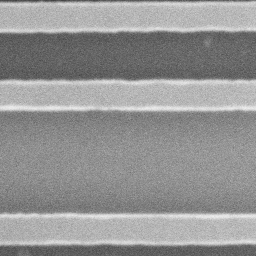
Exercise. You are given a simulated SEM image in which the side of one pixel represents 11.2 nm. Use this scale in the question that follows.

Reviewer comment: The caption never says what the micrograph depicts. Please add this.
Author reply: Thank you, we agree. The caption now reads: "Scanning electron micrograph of lines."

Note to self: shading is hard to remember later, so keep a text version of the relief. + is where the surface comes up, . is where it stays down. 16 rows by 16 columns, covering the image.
++++++++++++++++
++++++++++++++++
................
................
................
++++++++++++++++
++++++++++++++++
................
................
................
................
................
................
+++++++++++++.++
++++++++++++++++
................